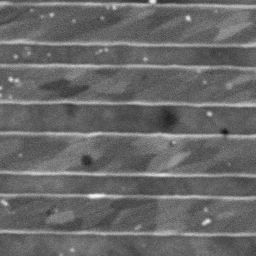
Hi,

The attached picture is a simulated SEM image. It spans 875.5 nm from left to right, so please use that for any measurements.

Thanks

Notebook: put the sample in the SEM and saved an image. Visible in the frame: wiring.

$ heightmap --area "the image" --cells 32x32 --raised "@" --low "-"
@@@@@@@@@@@@@@@@@-@@------------
@@@@@@@@@@@@@@@@@@@@@@@@@@@@@@@@
--@@@@@@@@@@@@@@@@@@@@@@@@@@@@@@
@@@@@@@@@@@@@@@@@@@@@@@@@@@@@@@@
@@@@@@@@@@@@@@@@@@@@@@@@@@@@@@@@
-----@@@@@@@@@@-@@@@@@@@@@@@@@@@
--------------------------------
--------------------------------
@@@@@@@@@@@@@@@@@@@@@@@@@@@@@@@-
@@@@@@@@@@@@@@@@@@@@@@@@@@@@@@@@
@@@@@@@@@@@@@@@@@@@@@@@@@@@@@@@@
@@@@@@@@@@@@@@@@@@@@@@@@@@@@@@@@
@@@@@@@@@@@@@@@@@@@@@@@@@@@@@@@@
--------------------------------
--------------------------------
--------------------------------
--------------------------------
@@@@@@@@@@@@@@@@@@@@@@@@@@@@@@@@
@@@@@@@@@@@@@@@@@@@@@@@@@@@@@@@@
@@@@@@@@@@@@@@@@@@@@@@@@@@@@@@@@
@@@@@@@@@@@@@@@@@@@@@@@@@@@@@@@@
@@@@@@@@@@@@@@@@@@@@-@@@@@@@@@@@
--------------------------------
--------------------------------
@@@@@@@@@@@@@@@--@--------------
@@@@@@@@@@@@@@@@@@@@@@@@@@@@@@@@
@@@@@@@@@@@@@@@@@@@@@@@@@@@@@@@@
@@@@@@@@@@@@@@@@@@@@@@@@@@@@@@@@
@@@@@@@@@@@@@@@@@@@@@@@@@@@@@@@@
--------------------------------
--------------------------------
--------------------------------